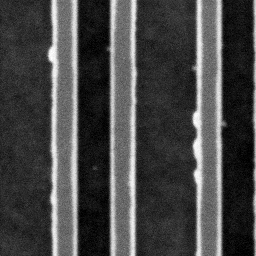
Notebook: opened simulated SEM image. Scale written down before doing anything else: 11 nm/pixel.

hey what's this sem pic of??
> lines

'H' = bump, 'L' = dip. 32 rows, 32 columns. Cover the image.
LLLLLLLHHLLLLLHHHLLLLLLLLHHHLLLL
LLLLLLLHHLLLLLHHHLLLLLLLLHHHLLLL
LLLLLLLHHLLLLLHHHLLLLLLLLHHHLLLL
LLLLLLLHHLLLLLHHHLLLLLLLLHHHLLLL
LLLLLLLHHLLLLLHHHLLLLLLLLHHHLLLL
LLLLLLLHHLLLLLHHHLLLLLLLLHHHLLLL
LLLLLLLHHLLLLLHHHLLLLLLLLHHHLLLL
LLLLLLLHHLLLLLHHHLLLLLLLLHHHLLLL
LLLLLLLHHLLLLLHHHLLLLLLLLHHHLLLL
LLLLLLLHHLLLLLHHHLLLLLLLLHHHLLLL
LLLLLLLHHLLLLLHHHLLLLLLLLHHHLLLL
LLLLLLLHHLLLLLHHHLLLLLLLLHHHLLLL
LLLLLLLHHLLLLLHHHLLLLLLLLHHHLLLL
LLLLLLLHHLLLLLHHHLLLLLLLLHHHLLLL
LLLLLLLHHLLLLLHHHLLLLLLLLHHHLLLL
LLLLLLLHHLLLLLHHHLLLLLLLLHHHLLLL
LLLLLLLHHLLLLLHHHLLLLLLLLHHHLLLL
LLLLLLLHHLLLLLHHHLLLLLLLLHHHLLLL
LLLLLLLHHLLLLLHHHLLLLLLLLHHHLLLL
LLLLLLLHHLLLLLHHHLLLLLLLLHHHLLLL
LLLLLLLHHLLLLLHHHLLLLLLLLHHHLLLL
LLLLLLLHHLLLLLHHHLLLLLLLLHHHLLLL
LLLLLLLHHLLLLLHHHLLLLLLLLHHHLLLL
LLLLLLLHHLLLLLHHHLLLLLLLLHHHLLLL
LLLLLLLHHLLLLLHHHLLLLLLLLHHHLLLL
LLLLLLLHHLLLLLHHHLLLLLLLLHHHLLLL
LLLLLLLHHLLLLLHHHLLLLLLLLHHHLLLL
LLLLLLLHHLLLLLHHHLLLLLLLLHHHLLLL
LLLLLLLHHHLLLLHHHLLLLLLLLHHHLLLL
LLLLLLLHHHLLLLHHHLLLLLLLLHHHLLLL
LLLLLLLHHLLLLLHHHLLLLLLLLHHHLLLL
LLLLLLLHHLLLLLHHHLLLLLLLLHHHLLLL